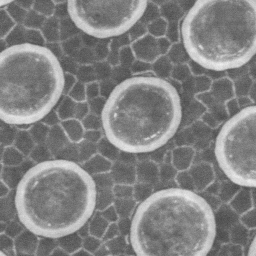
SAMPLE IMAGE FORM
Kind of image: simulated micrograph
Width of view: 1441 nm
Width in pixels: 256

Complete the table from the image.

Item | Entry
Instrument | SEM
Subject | raised bodies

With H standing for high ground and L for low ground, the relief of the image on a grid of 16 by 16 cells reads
LLLLHHHHHLLLHHHH
LLLLLHHHLLLLHHHH
LLLLLLLLLLLLHHHH
HHHLLLLLLLLLHHHL
HHHHLLLLLLLLLLLL
HHHHLLLLHHLLLLLL
HHHLLLLHHHHLLLLL
LHLLLLLHHHHLLLLH
LLLLLLLHHHLLLLHH
LLLLLLLLLLLLLLHH
LLHHHLLLLLLLLLHH
LHHHHHLLLLLLLLLL
LHHHHHLLLHHHLLLL
LHHHHLLLLHHHHLLL
LLLHLLLLHHHHHLLL
LLLLLLLLLHHHHLLL